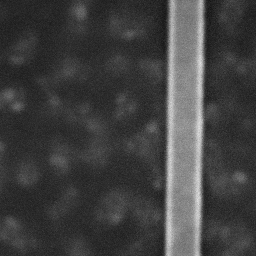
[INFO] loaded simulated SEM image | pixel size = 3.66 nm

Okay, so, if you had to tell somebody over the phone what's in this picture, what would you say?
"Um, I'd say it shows one or a few lines or trenches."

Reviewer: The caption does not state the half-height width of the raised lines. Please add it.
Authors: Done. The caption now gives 115 nm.